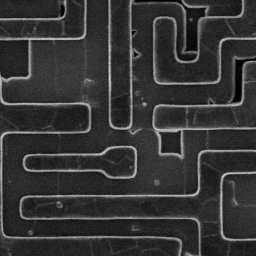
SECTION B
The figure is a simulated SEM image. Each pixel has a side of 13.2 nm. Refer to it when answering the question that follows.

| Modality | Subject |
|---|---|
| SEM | wiring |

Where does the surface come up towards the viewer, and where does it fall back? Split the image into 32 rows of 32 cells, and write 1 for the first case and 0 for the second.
00000000111000110000000000000011
00000000111000110000000000000011
11111111111000110000110001111111
11111111111000110001110001111111
11111111110000110001110001111111
00000000000000110001110001110000
00000000000000110001110001100000
00000000000000110001110011100000
00000000000000110001111111100011
00000000000000110001111111100011
00000000000000110000000000000011
00000000000000110000000000000011
00000000000000110000000000000011
11111111111000110000111111111111
11111111111000110001111111111111
11111111111000110001111111111111
11011011100000000000000000000000
00000000000000000000000000000000
00000000000000111000000000000000
00001111111111111000000001111111
00011111111111111000000001111111
00000000000001111000000001111111
00000000000000000000000001110000
00000000000000000000000001110000
00000000000000000110000111110000
00011111111111111111111111110000
00011111111111111111111111110000
00000000000000000000000011110000
00000000000000000000000001110000
10000000000000000000000001110000
11111111111111111111111001111111
11111111111111111111111001111111